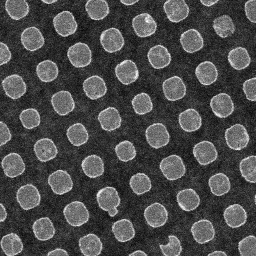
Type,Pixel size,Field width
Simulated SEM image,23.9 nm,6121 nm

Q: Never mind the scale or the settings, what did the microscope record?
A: a regular array of raised bodies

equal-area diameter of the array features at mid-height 0.529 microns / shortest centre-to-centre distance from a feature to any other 838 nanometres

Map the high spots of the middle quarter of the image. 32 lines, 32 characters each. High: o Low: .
...oo........ooooo....ooo.......
.............ooooo..............
.............ooooo..............
......ooo.....oooo.........oo...
.....ooooo....ooo........ooooo..
.....ooooo...............ooooo..
.....ooooo...............ooooo..
o.....o..o.........o.....ooooo..
oo.....o..........ooo.....ooo...
oo...............ooooo..........
oo...............ooooo..........
oo........ooo.....oooo.........o
.........ooooo...............ooo
.........ooooo...............ooo
.........ooooo...............ooo
..ooo....ooooo........ooo....ooo
.oooo......o.........ooooo....oo
.ooooo...............ooooo......
.ooooo...............ooooo......
..ooo..........o.....ooooo......
.............oooo.....oo........
.............ooooo..............
.............ooooo..............
......ooo.....ooo.........ooo...
.....ooooo...............ooooo..
.....ooooo..............oooooo..
.....ooooo..............oooooo..
o.....ooo................ooooo..
oo...............oooo.....ooo...
oo...............ooooo..........
oo...............ooooo..........
o........oooo....oooo..........o